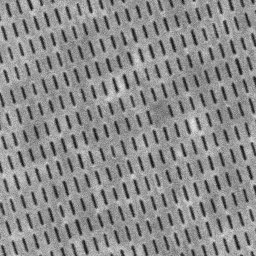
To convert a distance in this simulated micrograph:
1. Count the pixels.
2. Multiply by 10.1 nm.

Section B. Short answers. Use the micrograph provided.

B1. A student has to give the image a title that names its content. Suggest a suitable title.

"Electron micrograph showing a regular array of holes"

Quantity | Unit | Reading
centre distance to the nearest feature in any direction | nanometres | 112